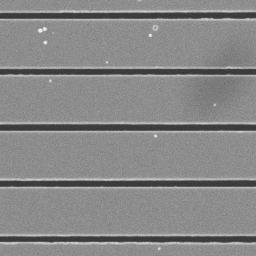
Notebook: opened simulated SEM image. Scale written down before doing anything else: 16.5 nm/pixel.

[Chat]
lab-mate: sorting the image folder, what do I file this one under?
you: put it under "lines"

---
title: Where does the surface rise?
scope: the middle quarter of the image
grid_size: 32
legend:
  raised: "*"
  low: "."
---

********************************
................................
................................
********************************
********************************
********************************
********************************
********************************
********************************
********************************
********************************
********************************
********************************
********************************
********************************
................................
................................
********************************
********************************
********************************
********************************
********************************
********************************
********************************
********************************
********************************
********************************
********************************
********************************
................................
................................
********************************